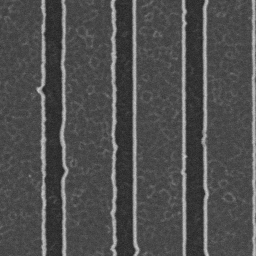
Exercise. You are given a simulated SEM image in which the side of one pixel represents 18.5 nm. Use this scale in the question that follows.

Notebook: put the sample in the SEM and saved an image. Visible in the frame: one or a few lines or trenches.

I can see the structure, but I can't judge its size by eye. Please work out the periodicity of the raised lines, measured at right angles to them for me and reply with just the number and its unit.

1300 nm